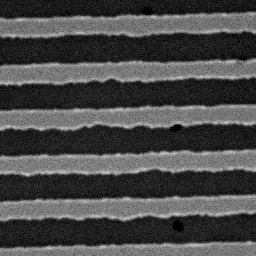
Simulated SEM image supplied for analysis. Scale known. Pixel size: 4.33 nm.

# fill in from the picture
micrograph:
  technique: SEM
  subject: lines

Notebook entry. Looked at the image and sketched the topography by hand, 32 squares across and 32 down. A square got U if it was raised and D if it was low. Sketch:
DDDDDDDDDDDDDDDDDDDDDDDDDDDDDDDD
DDDDDDDDDDDDDDDDDDDDDDDDDDDDDDDD
UUUUUUUUUUUUUUUUUUUUUUUUUUUUUUUU
UUUUUUUUUUUUUUUUUUUUUUUUUUUUUUUU
UUUUUUDDDDDDDDDDDDDDDDDDDDDDDDDD
DDDDDDDDDDDDDDDDDDDDDDDDDDDDDDDD
DDDDDDDDDDDDDDDDDDDDDDDDDDDDDDDD
DDDDDDDDDDDDDDDDDDDDDDDDDDDDDDDU
UUUUUUUUUUUUUUUUUUUUUUUUUUUUUUUU
UUUUUUUUUUUUUUUUUUUUUUUUUUUUUUUU
DDDDDDDDDDDDDDDDDDDDDDDDDDDDDDDD
DDDDDDDDDDDDDDDDDDDDDDDDDDDDDDDD
DDDDDDDDDDDDDDDDDDDDDDDDDDDDDDDD
DDDDDDDDDDDDDDDDDUUUUUUUUUUUUUUU
UUUUUUUUUUUUUUUUUUUUUUUUUUUUUUUU
UUUUUUUUUUUUUUUUUUUUUUUUDDDDDDUU
DDDDDDDDDDDDDDDDDDDDDDDDDDDDDDDD
DDDDDDDDDDDDDDDDDDDDDDDDDDDDDDDD
DDDDDDDDDDDDDDDDDDDDDDDDDDDDDDDD
DDDDDUDUUUUUUUUUUUUUUUUUUUUUUUUU
UUUUUUUUUUUUUUUUUUUUUUUUUUUUUUUU
UUUUUUUUUUUUUUUUUDDDDDDDDDDDDDDD
DDDDDDDDDDDDDDDDDDDDDDDDDDDDDDDD
DDDDDDDDDDDDDDDDDDDDDDDDDDDDDDDD
DDDDDDDDDDDDDDDDDDDDDDDDDDDDDDDU
UUUUUUUUUUUUUUUUUUUUUUUUUUUUUUUU
UUUUUUUUUUUUUUUUUUUUUUUUUUUUUUUU
UDDDDDDDDDDDDDDUDDDDDDDDDDDDDDDD
DDDDDDDDDDDDDDDDDDDDDDDDDDDDDDDD
DDDDDDDDDDDDDDDDDDDDDDDDDDDDDDDD
DDDDDDDDDDDDDDDDDDDDDDDDDDUUUUUU
UUUUUUUUUUUUUUUUUUUUUUUUUUUUUUUU